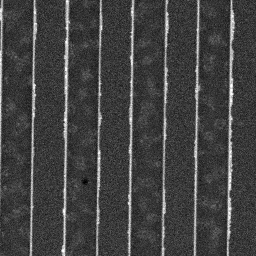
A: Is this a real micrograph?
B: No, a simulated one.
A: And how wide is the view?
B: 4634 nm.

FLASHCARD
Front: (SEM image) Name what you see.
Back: one or a few lines or trenches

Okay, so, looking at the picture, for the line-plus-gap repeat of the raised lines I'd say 1190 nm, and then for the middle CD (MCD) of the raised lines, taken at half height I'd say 0.584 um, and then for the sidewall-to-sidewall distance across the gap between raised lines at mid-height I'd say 600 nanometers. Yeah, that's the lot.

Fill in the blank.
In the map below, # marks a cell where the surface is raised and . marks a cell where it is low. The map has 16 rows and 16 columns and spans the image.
..##..##..##..##
..##..##..##..##
..##..##..##..##
..##..##..##..##
..##..##..##..##
..##..##..##..##
..##..##..##..##
..##..##..##..##
..##..##..##..##
..##..##..##..##
..##..##..##..##
..##..##..##..##
..##..##..##..##
..##..##..##..##
..##..##..##..##
..##..##..##..##